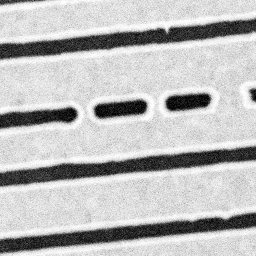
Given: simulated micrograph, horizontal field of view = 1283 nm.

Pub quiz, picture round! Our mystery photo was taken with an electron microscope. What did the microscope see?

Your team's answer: one or a few lines or trenches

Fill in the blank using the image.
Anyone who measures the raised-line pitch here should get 0.312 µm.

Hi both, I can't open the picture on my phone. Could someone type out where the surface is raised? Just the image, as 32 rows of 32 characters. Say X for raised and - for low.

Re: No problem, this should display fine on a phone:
-----XXXXXXXXXXXXXXXXXXXXXXXXXXX
XXXXXXXXXXXXXXXXXXXXXXXXXXXXXXXX
XXXXXXXXXXXXXXXXXXXXXXXXXXX-----
XXXXXXXXXXXXXXXXXX--------------
XXXXXXXX------------------------
-----------------------XXXXXXXXX
--------------XXXXXXXXXXXXXXXXXX
---XXXXXXXXXXXXXXXXXXXXXXXXXXXXX
XXXXXXXXXXXXXXXXXXXXXXXXXXXXXXXX
XXXXXXXXXXXXXXXXXXXXXXXXXXXXXXXX
XXXXXXXXXXXXXXXXXXXXXXXXXXXXXXXX
XXXXXXXXXXXXXXXXXXXXXXX---XXXXX-
XXXXXXXXXXXXXX----XX-------XXXX-
XXXX------X--------X------XXXXXX
----------XX------XXXXXXXXXXXXXX
---------XXXXXXXXXXXXXXXXXXXXXXX
XXXXXXXXXXXXXXXXXXXXXXXXXXXXXXXX
XXXXXXXXXXXXXXXXXXXXXXXXXXXXXXXX
XXXXXXXXXXXXXXXXXXXXXXXXXXX-----
XXXXXXXXXXXXXXXX----------------
XXXXXX-------------------------X
---------------------XXXXXXXXXXX
------------XXXXXXXXXXXXXXXXXXXX
---XXXXXXXXXXXXXXXXXXXXXXXXXXXXX
XXXXXXXXXXXXXXXXXXXXXXXXXXXXXXXX
XXXXXXXXXXXXXXXXXXXXXXXXXXXXXXXX
XXXXXXXXXXXXXXXXXXXXXXXXXXXXXX--
XXXXXXXXXXXXXXXXXXXXX-----------
XXXXXXXXXXX---------------------
------------------------XXXXXXXX
---------------XXXXXXXXXXXXXXXXX
-----XXXXXXXXXXXXXXXXXXXXXXXXXXX